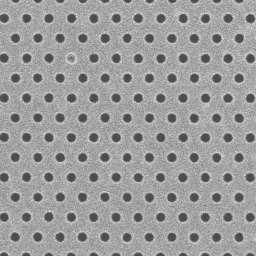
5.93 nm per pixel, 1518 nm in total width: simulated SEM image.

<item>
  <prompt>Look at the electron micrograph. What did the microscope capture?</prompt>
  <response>a regular array of holes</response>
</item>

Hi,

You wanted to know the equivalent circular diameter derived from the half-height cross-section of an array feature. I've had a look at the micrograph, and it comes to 56.4 nanometers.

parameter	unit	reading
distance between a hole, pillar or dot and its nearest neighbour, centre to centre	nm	131